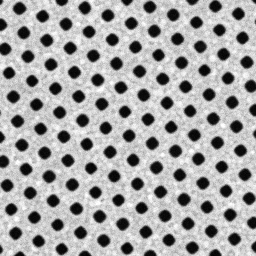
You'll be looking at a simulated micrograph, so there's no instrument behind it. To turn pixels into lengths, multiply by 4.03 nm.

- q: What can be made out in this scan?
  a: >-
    a regular array of holes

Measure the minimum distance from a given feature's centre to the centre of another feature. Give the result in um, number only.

0.0978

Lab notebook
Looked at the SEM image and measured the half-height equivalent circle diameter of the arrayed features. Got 12.2 px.